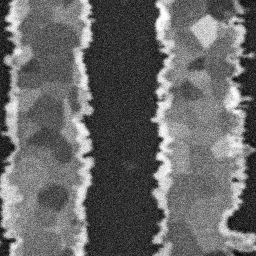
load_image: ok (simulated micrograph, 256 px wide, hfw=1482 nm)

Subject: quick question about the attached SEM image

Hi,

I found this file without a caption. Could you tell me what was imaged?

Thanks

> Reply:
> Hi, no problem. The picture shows one or a few lines or trenches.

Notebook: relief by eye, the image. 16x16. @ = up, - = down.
-@@@@-----@@@@@-
-@@@@-----@@@@@-
-@@@@-----@@@@@-
-@@@@-----@@@@@-
-@@@@-----@@@@@-
-@@@@-----@@@@@-
-@@@@-----@@@@@-
-@@@@-----@@@@@-
-@@@@-----@@@@@-
-@@@@-----@@@@@-
-@@@@-----@@@@@-
@@@@@-----@@@@@-
-@@@@-----@@@@@-
@@@@@-----@@@@--
@@@@@-----@@@@--
-@@@@-----@@@@@@